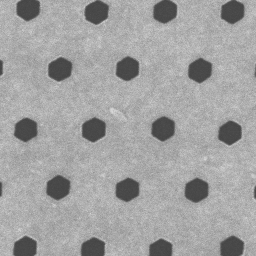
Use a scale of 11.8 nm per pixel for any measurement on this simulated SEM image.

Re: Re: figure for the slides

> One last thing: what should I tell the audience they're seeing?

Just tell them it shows a regular array of holes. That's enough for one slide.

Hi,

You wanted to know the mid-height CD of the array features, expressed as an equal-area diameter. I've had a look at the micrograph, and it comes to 284 nm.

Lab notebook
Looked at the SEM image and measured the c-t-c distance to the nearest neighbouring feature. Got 794 nm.